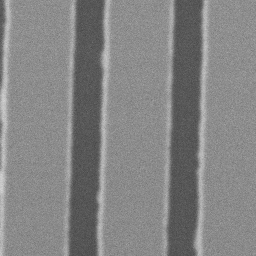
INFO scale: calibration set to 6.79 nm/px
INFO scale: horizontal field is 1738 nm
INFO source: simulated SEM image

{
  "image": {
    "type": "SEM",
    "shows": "lines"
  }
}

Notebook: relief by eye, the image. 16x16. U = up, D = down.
UUUUUDDUUUUDDUUU
UUUUUDDUUUUDDUUU
UUUUUDDUUUUDDUUU
UUUUUDDUUUUDDUUU
UUUUUDDUUUUDDUUU
UUUUDDUUUUUDDUUU
UUUUDDUUUUUDDUUU
UUUUDDUUUUUDDUUU
UUUUDDUUUUUDDUUU
UUUUDDUUUUUDDUUU
UUUUDDUUUUUDUUUU
UUUUDDUUUUUDUUUU
UUUUDDUUUUDDUUUU
UUUUDDUUUUDDUUUU
UUUUDDUUUUDDUUUU
UUUUDDUUUUDDUUUU